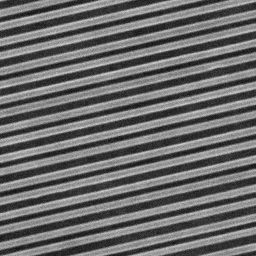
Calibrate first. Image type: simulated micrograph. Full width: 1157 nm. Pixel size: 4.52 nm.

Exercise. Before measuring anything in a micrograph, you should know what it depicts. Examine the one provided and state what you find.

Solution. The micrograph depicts parallel lines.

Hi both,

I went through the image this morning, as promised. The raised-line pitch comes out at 64.2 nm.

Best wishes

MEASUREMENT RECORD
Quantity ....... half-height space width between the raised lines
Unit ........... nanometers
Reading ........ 32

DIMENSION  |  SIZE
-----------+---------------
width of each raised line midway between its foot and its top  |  28.1 nanometers